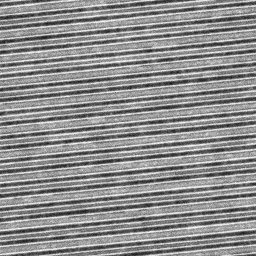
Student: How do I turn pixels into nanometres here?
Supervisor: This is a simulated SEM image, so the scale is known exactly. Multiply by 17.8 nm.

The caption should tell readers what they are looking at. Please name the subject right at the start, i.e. parallel lines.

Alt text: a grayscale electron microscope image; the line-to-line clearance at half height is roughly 0.0776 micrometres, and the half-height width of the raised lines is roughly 115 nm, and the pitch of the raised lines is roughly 212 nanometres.